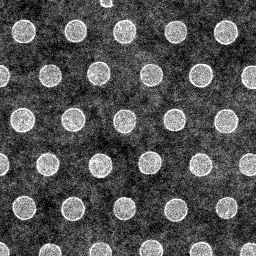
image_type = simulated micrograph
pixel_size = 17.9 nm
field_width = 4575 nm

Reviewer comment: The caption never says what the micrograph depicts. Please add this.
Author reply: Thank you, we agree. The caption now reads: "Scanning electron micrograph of a regular array of raised bodies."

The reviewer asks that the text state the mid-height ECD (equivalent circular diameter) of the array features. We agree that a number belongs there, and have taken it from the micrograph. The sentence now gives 0.397 µm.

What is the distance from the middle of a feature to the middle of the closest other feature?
883 nanometres